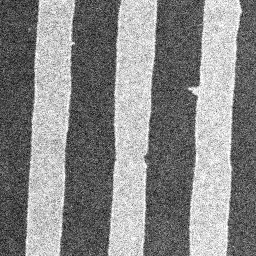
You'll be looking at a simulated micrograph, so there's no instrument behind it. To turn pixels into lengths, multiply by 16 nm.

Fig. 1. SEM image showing one or a few lines or trenches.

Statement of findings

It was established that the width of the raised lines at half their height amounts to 542 nanometers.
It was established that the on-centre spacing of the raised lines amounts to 1320 nanometers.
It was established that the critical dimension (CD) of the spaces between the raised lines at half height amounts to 775 nanometres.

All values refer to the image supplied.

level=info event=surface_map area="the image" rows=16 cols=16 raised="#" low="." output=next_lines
..###...##...##.
..##...###...##.
..##...###...##.
..##...###...##.
..##...###...##.
..##...##...###.
..##...##...##..
..##...##...##..
..##...##...##..
..##...##...##..
..##...##...##..
..##...##...##..
..##...##...##..
..##...##...##..
..##...##...##..
..##...##...##..